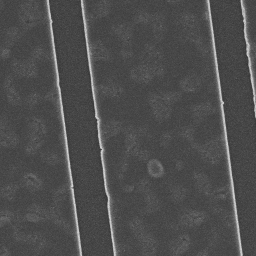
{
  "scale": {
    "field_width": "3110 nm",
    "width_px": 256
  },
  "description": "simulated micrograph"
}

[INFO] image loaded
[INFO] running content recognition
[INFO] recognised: one or a few lines or trenches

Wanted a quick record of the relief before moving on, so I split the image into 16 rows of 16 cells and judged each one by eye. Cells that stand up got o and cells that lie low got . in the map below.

ooo..oooooooo..o
ooo..oooooooo..o
ooo..oooooooo..o
ooo...ooooooo...
oooo..oooooooo..
oooo..oooooooo..
oooo..oooooooo..
oooo..oooooooo..
oooo..oooooooo..
oooo..oooooooo..
oooo..oooooooo..
ooooo..oooooooo.
ooooo..oooooooo.
ooooo..oooooooo.
ooooo..oooooooo.
ooooo..oooooooo.